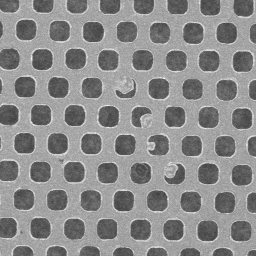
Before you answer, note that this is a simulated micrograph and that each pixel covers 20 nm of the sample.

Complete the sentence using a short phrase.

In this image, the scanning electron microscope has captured a regular array of holes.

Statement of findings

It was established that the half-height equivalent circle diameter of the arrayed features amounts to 22.3 px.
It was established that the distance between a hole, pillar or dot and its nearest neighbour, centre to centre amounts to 0.646 um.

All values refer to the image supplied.